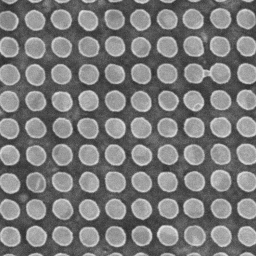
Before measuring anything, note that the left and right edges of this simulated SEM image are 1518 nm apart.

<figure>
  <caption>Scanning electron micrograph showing a regular array of raised bodies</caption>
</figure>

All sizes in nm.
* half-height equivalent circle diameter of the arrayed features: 118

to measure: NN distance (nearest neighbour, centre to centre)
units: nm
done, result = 155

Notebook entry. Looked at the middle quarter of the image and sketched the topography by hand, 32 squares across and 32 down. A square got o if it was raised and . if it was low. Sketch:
.....oo....ooo....oo....ooo....o
o...oooo..ooooo..oooo..ooooo..oo
oo..ooooo.ooooo..ooooo.ooooo..oo
o...oooo...oooo..ooooo..oooo..oo
o....ooo...ooo....ooo....oo.....
................................
................................
o...oooo...ooo....oo....ooo...oo
oo..oooo...oooo..oooo...oooo..oo
oo..oooo...oooo..ooooo..oooo..oo
oo..oooo...oooo..ooooo..oooo...o
o....oo.....oo....ooo.....o.....
................................
................................
o...oooo...oooo..oooo...oooo..oo
oo..oooo..ooooo..ooooo..oooo..oo
oo..oooo...oooo..ooooo..oooo..oo
oo..oooo...oooo..oooo...oooo...o
......o.........................
................................
o....oo.....o.....oo.....oo....o
oo..oooo...oooo..oooo...oooo..oo
oo..ooooo.ooooo..ooooo..oooo..oo
oo..ooooo..oooo..ooooo..oooo..oo
o....ooo...oooo...ooo....ooo...o
................................
................................
o....oo....ooo....ooo...ooo....o
oo..oooo...oooo..oooo...oooo..oo
oo..ooooo..oooo..ooooo..oooo..oo
oo..ooooo..oooo..ooooo..oooo...o
o....ooo...ooo.....oo....ooo....